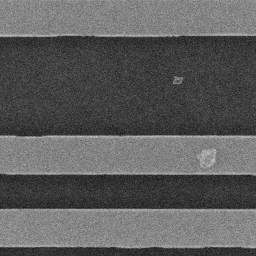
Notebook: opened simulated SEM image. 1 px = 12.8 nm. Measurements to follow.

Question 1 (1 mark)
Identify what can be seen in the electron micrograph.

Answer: lines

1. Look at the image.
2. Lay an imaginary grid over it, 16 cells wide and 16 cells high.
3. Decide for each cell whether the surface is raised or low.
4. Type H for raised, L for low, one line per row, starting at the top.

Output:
HHHHHHHHHHHHHHHH
HHHHHHHHHHHHHHHH
LLLLLLLLLLLLLLLL
LLLLLLLLLLLLLLLL
LLLLLLLLLLLLLLLL
LLLLLLLLLLLLLLLL
LLLLLLLLLLLLLLLL
LLLLLLLLLLLLLLLL
LLLLLLLLLLLLLLLL
HHHHHHHHHHHHHHHH
HHHHHHHHHHHHHHHH
LLLLLLLLLLLLLLLL
LLLLLLLLLLLLLLLL
HHHHHHHHHHHHHHHH
HHHHHHHHHHHHHHHH
LLLLLLLLLLLLLLLL